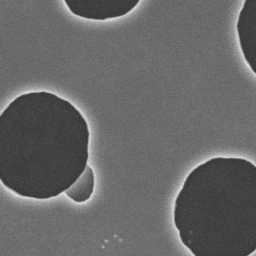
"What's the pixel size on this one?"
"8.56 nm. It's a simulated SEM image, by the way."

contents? holes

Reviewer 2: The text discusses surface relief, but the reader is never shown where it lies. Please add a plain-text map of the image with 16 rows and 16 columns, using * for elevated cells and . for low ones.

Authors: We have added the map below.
****....*******.
***************.
***************.
***************.
****************
****************
*...************
.....***********
......**********
.....***********
......******....
......*****.....
***********.....
***********.....
***********.....
************....